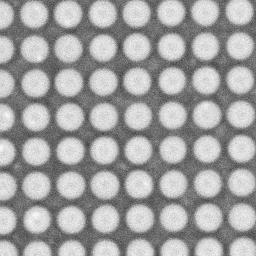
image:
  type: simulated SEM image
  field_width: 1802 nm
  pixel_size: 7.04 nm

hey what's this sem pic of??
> an array of small figures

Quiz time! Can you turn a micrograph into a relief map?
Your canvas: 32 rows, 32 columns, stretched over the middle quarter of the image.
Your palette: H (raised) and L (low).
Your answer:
LLLLLLLLLLLLLLLLLLLLLLLLLLLLLLLL
HHLLLLLLLHHLLLLLLHHHLLLLLHHHHLLL
HHHHLLLHHHHHLLLLHHHHHLLLHHHHHHLL
HHHHLLLHHHHHHLLHHHHHHLLLHHHHHHLL
HHHHHLLHHHHHHLLHHHHHHHLLHHHHHHLL
HHHHHLLHHHHHHLLHHHHHHHLLHHHHHHLL
HHHHLLLHHHHHHLLLHHHHHLLLLHHHHLLL
HHHLLLLLHHHLLLLLLHHHLLLLLLLLLLLL
LLLLLLLLLLLLLLLLLLLLLLLLLLLLLLLL
LLLLLLLLLLLLLLLLLLLLLLLLLLLLLLLL
HHHLLLLLHHHHLLLLLHHHHLLLLHHHHLLL
HHHHLLLHHHHHHLLLHHHHHLLLHHHHHHLL
HHHHHLLHHHHHHLLHHHHHHHLLHHHHHHLL
HHHHHLLHHHHHHLLHHHHHHHLLHHHHHHLL
HHHHHLLHHHHHHLLLHHHHHLLLHHHHHHLL
HHHHLLLLHHHHLLLLHHHHHLLLLHHHHLLL
LLLLLLLLLLLLLLLLLLLLLLLLLLLLLLLL
LLLLLLLLLLLLLLLLLLLLLLLLLLLLLLLL
LLLLLLLLLHHLLLLLLHHHLLLLLLHHHLLL
HHHHLLLLHHHHHLLLHHHHHLLLLHHHHHLL
HHHHHLLHHHHHHLLHHHHHHHLLHHHHHHLL
HHHHHLLHHHHHHLLLHHHHHHLLHHHHHHLL
HHHHHLLHHHHHHLLLHHHHHHLLHHHHHHLL
HHHHLLLHHHHHHLLLHHHHHLLLLHHHHHLL
HHHLLLLLHHHHLLLLLHHHLLLLLLHHLLLL
LLLLLLLLLLLLLLLLLLLLLLLLLLLLLLLL
LLLLLLLLLLLLLLLLLLLLLLLLLLLLLLLL
HHHHLLLLHHHHLLLLLHHHHLLLLHHHHHLL
HHHHHLLHHHHHHLLLHHHHHHLLLHHHHHLL
HHHHHLLHHHHHHHLLHHHHHHLLHHHHHHHL
HHHHHLLHHHHHHHLLHHHHHHLLHHHHHHHL
HHHHHLLHHHHHHLLLHHHHHHLLHHHHHHLL